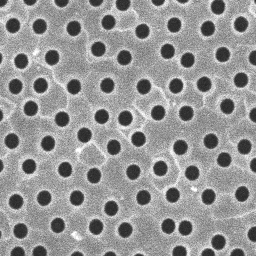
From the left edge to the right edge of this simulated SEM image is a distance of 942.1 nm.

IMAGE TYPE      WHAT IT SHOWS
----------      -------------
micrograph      a regular array of holes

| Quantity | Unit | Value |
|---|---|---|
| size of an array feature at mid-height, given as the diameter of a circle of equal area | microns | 0.0518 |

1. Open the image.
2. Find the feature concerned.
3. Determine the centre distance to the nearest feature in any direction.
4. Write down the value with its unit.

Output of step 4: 103 nanometers